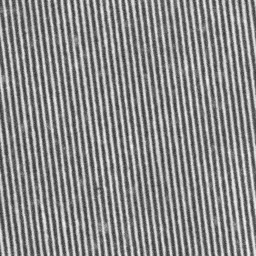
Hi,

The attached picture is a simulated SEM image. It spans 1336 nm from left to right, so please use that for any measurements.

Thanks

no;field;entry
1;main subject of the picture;parallel lines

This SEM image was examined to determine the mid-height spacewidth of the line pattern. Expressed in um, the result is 0.0247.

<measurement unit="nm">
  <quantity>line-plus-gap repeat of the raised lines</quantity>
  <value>33.5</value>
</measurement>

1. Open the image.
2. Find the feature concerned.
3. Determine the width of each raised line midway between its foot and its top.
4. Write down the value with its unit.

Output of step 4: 7.8 nm